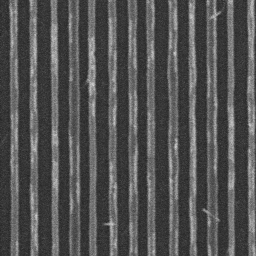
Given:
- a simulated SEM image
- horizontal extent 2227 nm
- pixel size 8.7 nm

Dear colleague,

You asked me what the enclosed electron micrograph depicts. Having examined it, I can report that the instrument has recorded parallel lines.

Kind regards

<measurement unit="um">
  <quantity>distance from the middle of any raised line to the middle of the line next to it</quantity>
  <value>0.172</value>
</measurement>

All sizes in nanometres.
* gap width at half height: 114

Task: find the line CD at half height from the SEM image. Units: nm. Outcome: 57.7